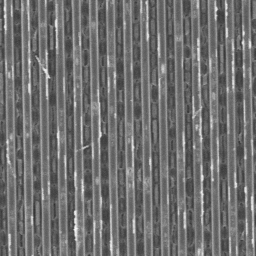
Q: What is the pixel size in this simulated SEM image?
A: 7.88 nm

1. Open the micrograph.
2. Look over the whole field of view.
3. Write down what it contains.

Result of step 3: parallel lines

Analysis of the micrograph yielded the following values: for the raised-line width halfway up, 59.1 nm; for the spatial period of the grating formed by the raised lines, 134 nm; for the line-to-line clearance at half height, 72.8 nanometers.